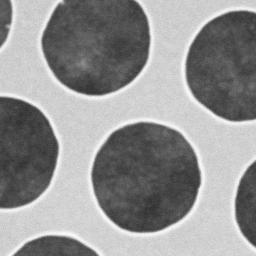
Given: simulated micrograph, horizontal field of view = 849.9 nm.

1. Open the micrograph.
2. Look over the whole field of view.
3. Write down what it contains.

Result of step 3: holes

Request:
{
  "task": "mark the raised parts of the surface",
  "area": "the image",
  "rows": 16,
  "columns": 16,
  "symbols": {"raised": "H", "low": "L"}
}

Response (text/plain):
LHHLLLLLLHHHHHHH
LHHLLLLLLHHHHLLL
HHHLLLLLLHHHLLLL
HHHLLLLLLHHHLLLL
HHHLLLLLLHHHLLLL
HHHHLLLLHHHHLLLL
LLHHHHHHHHHHHLLL
LLLHHHHHHHHHHHLL
LLLHHHHLLLLHHHHH
LLLLHHLLLLLLHHHH
LLLHHHLLLLLLHHHH
LLLHHHLLLLLLLHHL
LLHHHHLLLLLLHHHL
HHHHHHHLLLLLHHHL
HHHHHHHHLLHHHHHL
HLLLLLHHHHHHHHHH